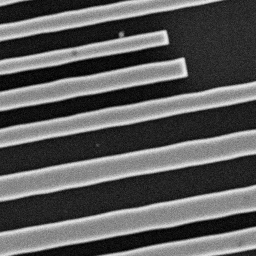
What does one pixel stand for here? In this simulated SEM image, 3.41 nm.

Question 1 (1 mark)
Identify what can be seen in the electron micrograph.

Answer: groups of lines, slits or small figures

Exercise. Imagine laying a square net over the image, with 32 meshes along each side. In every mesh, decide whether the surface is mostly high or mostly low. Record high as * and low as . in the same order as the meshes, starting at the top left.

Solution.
*.............***********.......
........***********.............
...***********..................
*********.......................
****.............****...........
...........**********...........
......**********................
**********............*.........
*****...........*******.........
...........************.........
.....**************............*
*************............*******
********...........************.
**............************......
.........************...........
...*************................
**********....................**
*****....................*******
....................************
..............****************..
........*****************.......
...*****************............
**************..................
*********......................*
***......................*******
....................************
..............*****************.
.........*****************......
...*****************...........*
***************...........******
*********...........************
****...........**************...